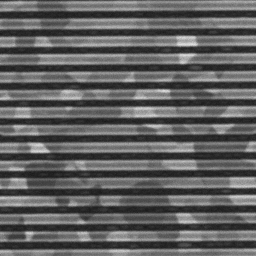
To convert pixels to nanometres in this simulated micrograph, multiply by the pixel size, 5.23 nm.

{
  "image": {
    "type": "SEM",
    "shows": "parallel lines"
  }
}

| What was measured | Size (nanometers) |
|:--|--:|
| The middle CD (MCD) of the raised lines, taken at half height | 39.9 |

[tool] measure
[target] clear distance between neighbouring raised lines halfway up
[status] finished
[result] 0.0523 microns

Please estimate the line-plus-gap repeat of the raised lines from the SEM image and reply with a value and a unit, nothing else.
92.8 nm